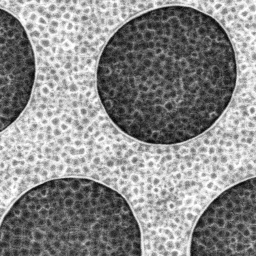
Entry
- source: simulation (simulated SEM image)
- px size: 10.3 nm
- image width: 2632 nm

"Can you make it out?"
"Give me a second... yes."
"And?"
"holes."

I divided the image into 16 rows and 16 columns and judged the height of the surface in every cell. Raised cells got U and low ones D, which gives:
UUUUUUUUUUDDUUUU
DUUUUUUUDDDDDDUU
DDUUUUUDDDDDDDUU
DDUUUUDDDDDDDDDU
DDUUUUDDDDDDDDDU
DDUUUUDDDDDDDDDU
DDUUUUDDDDDDDDUU
DUUUUUUDDDDDDDUU
UUUUUUUUDDDDUUUU
UUUUUUUUUUUUUUUU
UUUUUUUUUUUUUUUU
UUUDDDUUUUUUUUUD
UDDDDDDDUUUUUDDD
DDDDDDDDUUUUUDDD
DDDDDDDDDUUUDDDD
DDDDDDDDDUUUDDDD